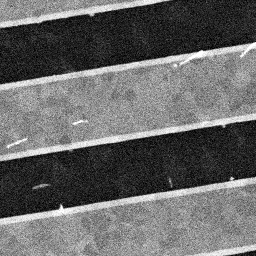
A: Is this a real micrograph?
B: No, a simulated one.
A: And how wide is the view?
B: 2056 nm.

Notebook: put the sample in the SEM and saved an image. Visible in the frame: one or a few lines or trenches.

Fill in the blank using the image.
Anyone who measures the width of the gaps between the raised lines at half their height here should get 0.501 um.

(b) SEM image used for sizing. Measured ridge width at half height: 565 nm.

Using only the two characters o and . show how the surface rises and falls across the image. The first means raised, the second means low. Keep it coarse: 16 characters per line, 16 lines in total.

ooooooo.........
o...............
................
............oooo
.....ooooooooooo
oooooooooooooooo
oooooooooooooooo
ooooooooooooooo.
ooooooooo.......
ooo.............
................
..............oo
........oooooooo
..oooooooooooooo
oooooooooooooooo
oooooooooooooooo